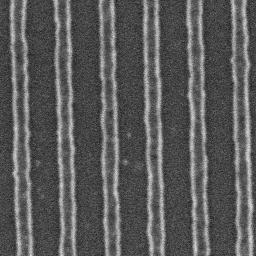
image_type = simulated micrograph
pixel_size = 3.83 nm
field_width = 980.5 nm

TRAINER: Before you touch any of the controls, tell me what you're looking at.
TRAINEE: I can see parallel lines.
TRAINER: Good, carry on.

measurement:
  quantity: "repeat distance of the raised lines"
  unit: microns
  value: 0.169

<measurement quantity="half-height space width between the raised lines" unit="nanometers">121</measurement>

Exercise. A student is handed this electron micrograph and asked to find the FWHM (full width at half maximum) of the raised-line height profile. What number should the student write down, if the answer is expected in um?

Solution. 0.0474